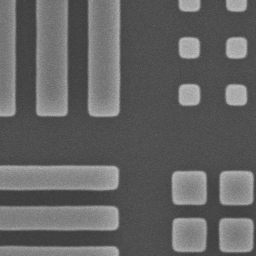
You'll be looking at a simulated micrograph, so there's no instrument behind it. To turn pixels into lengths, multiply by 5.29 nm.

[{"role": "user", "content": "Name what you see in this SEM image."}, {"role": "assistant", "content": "groups of lines, slits or small figures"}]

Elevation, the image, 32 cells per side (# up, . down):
##...###...####.......###...###.
##...###...####.................
##...###...####.................
##...###...####.................
##...###...####.................
##...###...####.......###...###.
##...###...####.......###...###.
##...###...####.................
##...###...####.................
##...###...####.................
##...###...####.................
##...###...####.......###...###.
##...###...####.......###...###.
##...###...####.................
#......#....##..................
................................
................................
................................
................................
................................
................................
###############.......###...###.
###############.......####..####
##############........####..####
......................####..####
......................###...###.
###############.................
###############.......###...###.
##############........####.#####
......................####.#####
......................####..####
###############.................